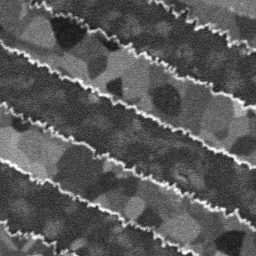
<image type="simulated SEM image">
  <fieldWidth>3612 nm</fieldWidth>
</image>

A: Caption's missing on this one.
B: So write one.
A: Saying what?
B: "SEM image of one or a few lines or trenches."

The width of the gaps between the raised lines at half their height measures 742 nanometers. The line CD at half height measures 717 nm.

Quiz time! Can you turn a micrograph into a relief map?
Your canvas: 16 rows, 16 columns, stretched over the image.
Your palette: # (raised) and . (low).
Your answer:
###........#####
#####.......####
#######.......##
..#######.......
...########.....
.....########...
.......########.
##........######
####........####
######........##
.#######........
...#######......
.....#######....
.......########.
#........#######
###........#####